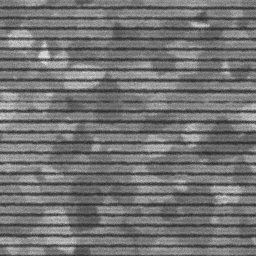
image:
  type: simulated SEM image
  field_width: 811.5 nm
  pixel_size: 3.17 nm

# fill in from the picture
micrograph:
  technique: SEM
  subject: parallel lines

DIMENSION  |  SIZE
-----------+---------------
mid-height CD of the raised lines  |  20.2 nm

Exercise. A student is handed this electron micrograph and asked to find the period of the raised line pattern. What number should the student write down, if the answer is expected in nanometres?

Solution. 32.8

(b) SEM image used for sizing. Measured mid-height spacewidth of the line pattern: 14.3 nm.